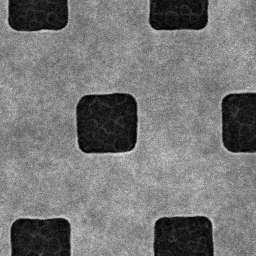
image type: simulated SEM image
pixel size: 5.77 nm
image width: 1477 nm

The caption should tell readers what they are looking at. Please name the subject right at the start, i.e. holes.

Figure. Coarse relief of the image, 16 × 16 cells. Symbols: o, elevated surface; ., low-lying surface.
o...ooooo....ooo
o...ooooo....ooo
oooooooooooooooo
oooooooooooooooo
oooooooooooooooo
oooooooooooooooo
ooooo....ooooo..
ooooo....ooooo..
ooooo....ooooo..
ooooo...ooooooo.
oooooooooooooooo
oooooooooooooooo
oooooooooooooooo
oooooooooooooooo
o...oooooo...ooo
o...oooooo...ooo